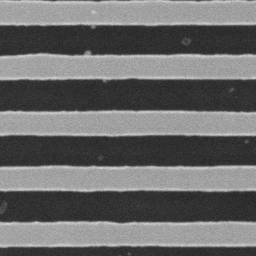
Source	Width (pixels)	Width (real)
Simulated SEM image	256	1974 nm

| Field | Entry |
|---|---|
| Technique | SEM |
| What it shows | lines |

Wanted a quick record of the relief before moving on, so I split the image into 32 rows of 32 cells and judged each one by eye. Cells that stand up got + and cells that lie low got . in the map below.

++++++++++++++++++++++++++++++++
++++++++++++++++++++++++++++++++
++++++++++++++++++++++++++++++++
................................
................................
................................
................................
++++++++++++++++++++++++++++++++
++++++++++++++++++++++++++++++++
++++++++++++++++++++++++++++++++
................................
................................
................................
................................
++++++++++++++++++++++++++++++++
++++++++++++++++++++++++++++++++
++++++++++++++++++++++++++++++++
................................
................................
................................
................................
++++++++++++++++++++++++++++++++
++++++++++++++++++++++++++++++++
++++++++++++++++++++++++++++++++
................................
................................
................................
................................
++++++++++++++++++++++++++++++++
++++++++++++++++++++++++++++++++
++++++++++++++++++++++++++++++++
................................